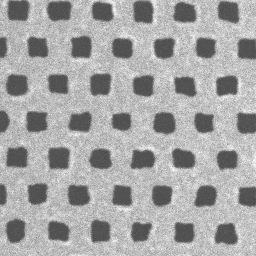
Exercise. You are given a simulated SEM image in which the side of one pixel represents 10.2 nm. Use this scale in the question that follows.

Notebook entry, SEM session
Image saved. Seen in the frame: a regular array of holes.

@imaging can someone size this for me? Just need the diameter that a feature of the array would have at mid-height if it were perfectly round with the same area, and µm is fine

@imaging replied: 0.227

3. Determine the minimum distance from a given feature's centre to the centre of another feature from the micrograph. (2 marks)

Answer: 418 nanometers